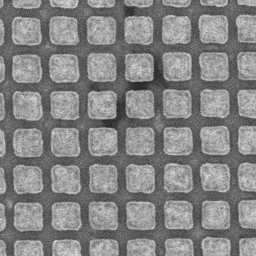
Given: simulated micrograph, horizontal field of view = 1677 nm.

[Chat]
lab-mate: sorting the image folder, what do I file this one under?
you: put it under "a regular array of raised bodies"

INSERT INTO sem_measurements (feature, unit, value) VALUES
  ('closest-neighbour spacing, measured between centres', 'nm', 241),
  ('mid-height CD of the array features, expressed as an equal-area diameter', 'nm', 199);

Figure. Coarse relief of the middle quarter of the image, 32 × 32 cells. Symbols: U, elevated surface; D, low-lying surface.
UUUDDDUUUUUUUDDDUUUUUUDDDUUUUUUU
UUUDDDUUUUUUUDDDUUUUUUDDDUUUUUUU
UUUDDDUUUUUUUDDDUUUUUUDDDUUUUUUU
UUUDDDUUUUUUUDDDUUUUUUDDDUUUUUUD
DDDDDDDDDDDDDDDDDDDDDDDDDDDDDDDD
DDDDDDDDDDDDDDDDDDDDDDDDDDDDDDDD
DDDDDDDDDDDDDDDDDDDDDDDDDDDDDDDD
UUUDDDUUUUUUUDDDUUUUUUDDDUUUUUUD
UUUDDDUUUUUUUDDDUUUUUUDDDUUUUUUU
UUUUDDUUUUUUUDDDUUUUUUDDDUUUUUUU
UUUUDDUUUUUUUDDDUUUUUUDDDUUUUUUU
UUUUDDUUUUUUUDDDUUUUUUDDDUUUUUUU
UUUUDDUUUUUUUDDDUUUUUUDDDUUUUUUU
UUUDDDDDDDUUDDDDDDDDDUDDDDDDDDDD
DDDDDDDDDDDDDDDDDDDDDDDDDDDDDDDD
DDDDDDDDDDDDDDDDDDDDDDDDDDDDDDDD
UUUDDDDUUUUUUDDDUUUUUUDDDUUUUUUU
UUUUDDUUUUUUUDDDUUUUUUDDDUUUUUUU
UUUDDDUUUUUUUDDDUUUUUUDDDUUUUUUU
UUUUDDUUUUUUUDDDUUUUUUDDDUUUUUUU
UUUUDDUUUUUUUDDDUUUUUUDDDUUUUUUU
UUUUDDUUUUUUUDDUUUUUUUDDDUUUUUUU
UUUUDDDUUUUUUDDDDDDUUUDDDDDUUUUD
DDDDDDDDDDDDDDDDDDDDDDDDDDDDDDDD
DDDDDDDDDDDDDDDDDDDDDDDDDDDDDDDD
DDDDDDDDDDDDDDDDUUUUUDDDDUUUUUUD
UUUUDDUUUUUUUDDDUUUUUUDDDUUUUUUU
UUUUDDUUUUUUUDDDUUUUUUDDDUUUUUUU
UUUUDDDUUUUUUDDDUUUUUUDDDUUUUUUU
UUUUDDUUUUUUUDDDUUUUUUUDDUUUUUUU
UUUUDDUUUUUUUDDDUUUUUUUDDUUUUUUU
UUUUDDDUUUUUUDDDUUUUUUDDDUUUUUUU